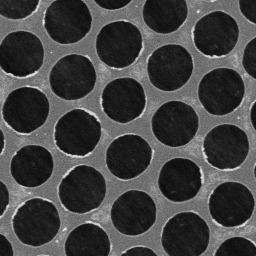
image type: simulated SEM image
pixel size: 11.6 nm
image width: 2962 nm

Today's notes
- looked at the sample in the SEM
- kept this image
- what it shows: a regular array of holes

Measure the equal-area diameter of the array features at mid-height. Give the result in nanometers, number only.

532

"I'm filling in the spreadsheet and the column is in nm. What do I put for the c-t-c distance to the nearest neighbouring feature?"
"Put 648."